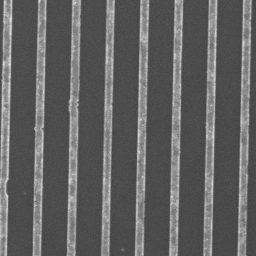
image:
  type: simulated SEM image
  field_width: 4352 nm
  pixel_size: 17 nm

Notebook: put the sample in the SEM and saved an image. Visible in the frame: parallel lines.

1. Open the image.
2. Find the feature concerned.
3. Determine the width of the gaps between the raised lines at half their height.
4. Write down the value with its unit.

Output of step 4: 463 nanometers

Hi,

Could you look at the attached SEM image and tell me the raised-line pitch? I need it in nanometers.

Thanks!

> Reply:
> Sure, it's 582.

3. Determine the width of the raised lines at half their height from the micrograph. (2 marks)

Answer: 123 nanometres